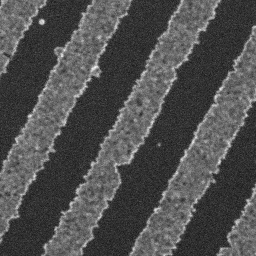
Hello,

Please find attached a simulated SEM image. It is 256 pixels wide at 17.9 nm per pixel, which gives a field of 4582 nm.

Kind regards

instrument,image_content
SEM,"one or a few lines or trenches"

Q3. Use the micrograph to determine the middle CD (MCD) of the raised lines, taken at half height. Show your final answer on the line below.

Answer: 581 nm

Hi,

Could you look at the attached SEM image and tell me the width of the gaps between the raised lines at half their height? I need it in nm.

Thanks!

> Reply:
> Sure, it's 797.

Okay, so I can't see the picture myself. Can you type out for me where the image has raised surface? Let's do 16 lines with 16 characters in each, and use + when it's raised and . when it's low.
+++...++...++...
++...++....++...
+...+++...++....
+...++...+++...+
...+++...++...++
...++...+++...++
..+++...++...+++
..++...+++...++.
.+++...++...+++.
.++...++....++..
++....+....+++..
++...++....++...
+....++...++....
+...++...+++...+
...+++...++...++
...++...+++...++